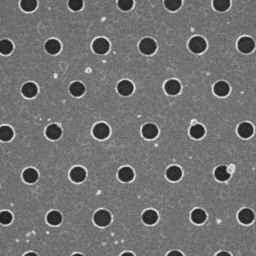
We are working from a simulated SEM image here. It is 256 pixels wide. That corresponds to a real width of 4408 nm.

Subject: a regular array of holes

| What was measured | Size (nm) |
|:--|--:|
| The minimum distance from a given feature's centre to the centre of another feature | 822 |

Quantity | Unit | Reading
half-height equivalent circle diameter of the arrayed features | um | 0.288